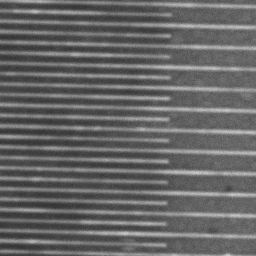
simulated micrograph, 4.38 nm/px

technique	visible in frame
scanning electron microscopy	parallel lines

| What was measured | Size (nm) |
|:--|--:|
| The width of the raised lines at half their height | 8.2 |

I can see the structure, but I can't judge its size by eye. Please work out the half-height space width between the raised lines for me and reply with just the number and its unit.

35.6 nanometres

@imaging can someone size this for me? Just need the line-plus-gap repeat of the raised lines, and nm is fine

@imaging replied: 45.8